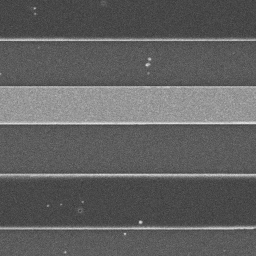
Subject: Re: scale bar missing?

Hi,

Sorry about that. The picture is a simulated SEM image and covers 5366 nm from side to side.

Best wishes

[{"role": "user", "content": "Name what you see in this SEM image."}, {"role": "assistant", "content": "lines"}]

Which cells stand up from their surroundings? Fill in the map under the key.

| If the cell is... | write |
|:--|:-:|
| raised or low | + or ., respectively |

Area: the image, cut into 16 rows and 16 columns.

++++++++++++++++
++++++++++++++++
++++++++++++++++
................
................
++++++++++++++++
++++++++++++++++
++++++++++++++++
................
................
................
++++++++++++++++
++++++++++++++++
++++++++++++++++
................
................